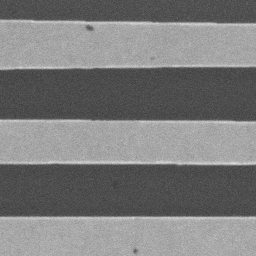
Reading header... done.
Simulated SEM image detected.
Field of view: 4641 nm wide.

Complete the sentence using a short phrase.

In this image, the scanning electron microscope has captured lines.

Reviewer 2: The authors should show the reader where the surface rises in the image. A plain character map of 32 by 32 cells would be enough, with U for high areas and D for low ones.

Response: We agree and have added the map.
DDDDDDDDDDDDDDDDDDDDDDDDDDDDDDDD
DDDDDDDDDDDDDDDDDDDDDDDDDDDDDDDD
DDDDDDDDDDDDDDDDDDDDDDDDDDDDDDDD
UUUUUUUUUUUUUUUUUUUUUUUUUUUUUUUU
UUUUUUUUUUUUUUUUUUUUUUUUUUUUUUUU
UUUUUUUUUUUUUUUUUUUUUUUUUUUUUUUU
UUUUUUUUUUUUUUUUUUUUUUUUUUUUUUUU
UUUUUUUUUUUUUUUUUUUUUUUUUUUUUUUU
UUUUUUUUUDDDDDDDDDDDDDDDDDDDDDDD
DDDDDDDDDDDDDDDDDDDDDDDDDDDDDDDD
DDDDDDDDDDDDDDDDDDDDDDDDDDDDDDDD
DDDDDDDDDDDDDDDDDDDDDDDDDDDDDDDD
DDDDDDDDDDDDDDDDDDDDDDDDDDDDDDDD
DDDDDDDDDDDDDDDDDDDDDDDDDDDDDDDD
DDDDDDDDDDDDDDDDDDDDDDDDDDDDDDDD
UUUUUUUUUUUUUUUUUUUUUUUUUUUUUUUU
UUUUUUUUUUUUUUUUUUUUUUUUUUUUUUUU
UUUUUUUUUUUUUUUUUUUUUUUUUUUUUUUU
UUUUUUUUUUUUUUUUUUUUUUUUUUUUUUUU
UUUUUUUUUUUUUUUUUUUUUUUUUUUUUUUU
DDDDDDDDDDDDDDDDDDDDDDDDDDUDUUUD
DDDDDDDDDDDDDDDDDDDDDDDDDDDDDDDD
DDDDDDDDDDDDDDDDDDDDDDDDDDDDDDDD
DDDDDDDDDDDDDDDDDDDDDDDDDDDDDDDD
DDDDDDDDDDDDDDDDDDDDDDDDDDDDDDDD
DDDDDDDDDDDDDDDDDDDDDDDDDDDDDDDD
DDDDDDDDDDDDDDDDDDDDDDDDDDDDDDDD
UUUUUUUUUUUUUUUUUUUUUUUUUUUUUUUU
UUUUUUUUUUUUUUUUUUUUUUUUUUUUUUUU
UUUUUUUUUUUUUUUUUUUUUUUUUUUUUUUU
UUUUUUUUUUUUUUUUUUUUUUUUUUUUUUUU
UUUUUUUUUUUUUUUUUUUUUUUUUUUUUUUU